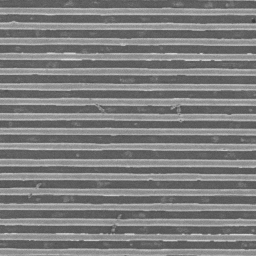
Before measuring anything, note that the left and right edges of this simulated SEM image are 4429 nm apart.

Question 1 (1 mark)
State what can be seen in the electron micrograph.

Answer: parallel lines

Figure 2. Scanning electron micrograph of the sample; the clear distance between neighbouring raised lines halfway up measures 171 nanometers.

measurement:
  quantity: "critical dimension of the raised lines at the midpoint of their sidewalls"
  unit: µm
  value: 0.0865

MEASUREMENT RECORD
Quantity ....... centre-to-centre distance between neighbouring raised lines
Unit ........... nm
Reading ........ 260